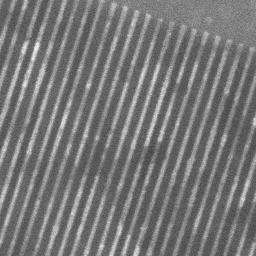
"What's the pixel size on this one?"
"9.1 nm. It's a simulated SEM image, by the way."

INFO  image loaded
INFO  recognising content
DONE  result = parallel lines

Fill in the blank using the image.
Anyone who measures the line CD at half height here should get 27.1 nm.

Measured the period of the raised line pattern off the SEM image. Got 110 nanometres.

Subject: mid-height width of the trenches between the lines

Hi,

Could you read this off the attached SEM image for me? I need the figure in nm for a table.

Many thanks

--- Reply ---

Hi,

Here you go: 79.1